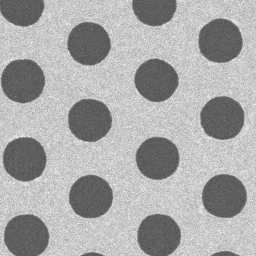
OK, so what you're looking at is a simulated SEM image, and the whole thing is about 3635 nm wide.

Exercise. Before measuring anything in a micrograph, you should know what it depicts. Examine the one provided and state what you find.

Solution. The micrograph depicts a regular array of holes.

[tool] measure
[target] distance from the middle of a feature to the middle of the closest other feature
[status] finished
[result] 1080 nm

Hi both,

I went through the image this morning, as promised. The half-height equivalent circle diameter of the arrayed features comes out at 44.2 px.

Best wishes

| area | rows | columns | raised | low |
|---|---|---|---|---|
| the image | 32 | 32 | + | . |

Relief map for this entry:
......+++++++++++.....++++++++++
.....++++++++++++.....++++++++++
+....++++++++++++....++++++..+++
+++++++++....++++++++++++.....++
+++++++++.....+++++++++++.....++
++++++++......+++++++++++.....++
+++++++++.....+++++++++++.....++
++..+++++....+++++..++++++...+++
+....++++++++++++.....++++++++++
......+++++++++++.....++++++++++
......+++++++++++.....++++++++++
.....++++++++++++.....++++++++++
+...++++++..+++++++..+++++...+++
+++++++++.....+++++++++++.....++
+++++++++.....+++++++++++......+
++++++++......+++++++++++.....++
+++++++++.....++++++++++++....++
++...+++++..++++++...+++++++++++
+....++++++++++++.....++++++++++
......+++++++++++.....++++++++++
......+++++++++++.....++++++++++
+....+++++++++++++....++++++++++
++..++++++...+++++++++++++....++
+++++++++.....+++++++++++......+
+++++++++.....+++++++++++......+
+++++++++.....+++++++++++......+
+++++++++....+++++++++++++....++
+....+++++++++++++....++++++++++
+.....+++++++++++.....++++++++++
......+++++++++++......+++++++++
+.....+++++++++++.....++++++++++
+....+++++++++++++....+++++..+++